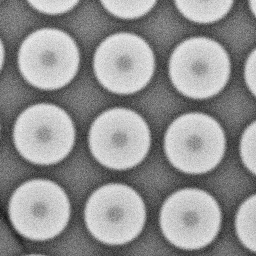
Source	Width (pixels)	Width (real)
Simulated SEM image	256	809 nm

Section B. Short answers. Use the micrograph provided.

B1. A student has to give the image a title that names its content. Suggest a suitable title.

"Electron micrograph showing an array of small figures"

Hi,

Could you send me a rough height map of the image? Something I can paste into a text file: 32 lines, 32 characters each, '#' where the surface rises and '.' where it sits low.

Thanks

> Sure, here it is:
....#####....######...#######..#
.....###......####.....#####....
........................###.....
................................
....####......###...............
...######....#####.....####.....
..########..#######...######....
..########..#######..########..#
...#######..#######..########..#
...######...#######..########..#
....####.....#####....######...#
..............###......####.....
................................
....###.........................
...#####....#####......###......
..#######...######....#####.....
..#######..########..#######...#
..#######..########..#######..##
..#######..########..#######..##
...#####....######...#######..##
.............####.....#####....#
.......................##.......
................................
..#####......###................
..######...######....#####......
.########..#######...######...##
.########..#######..#######...##
.#######...#######..########..##
..######...#######..#######...##
...####.....#####....######...##
......................####....##
................................